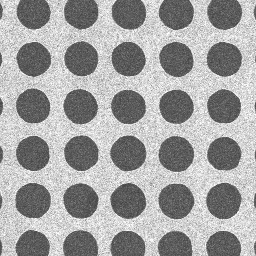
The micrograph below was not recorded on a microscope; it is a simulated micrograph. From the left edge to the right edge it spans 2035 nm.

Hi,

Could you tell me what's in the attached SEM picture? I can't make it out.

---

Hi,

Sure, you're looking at a regular array of holes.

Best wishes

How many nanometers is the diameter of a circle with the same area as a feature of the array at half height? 275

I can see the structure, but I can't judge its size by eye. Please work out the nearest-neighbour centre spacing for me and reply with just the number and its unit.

374 nm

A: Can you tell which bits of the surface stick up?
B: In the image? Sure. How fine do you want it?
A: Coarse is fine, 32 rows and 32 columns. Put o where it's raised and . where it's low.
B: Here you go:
oo....oo....oo....oo....oo....oo
oo....oo....oo....oo....oo....oo
oo....oo....oo....oo....oo....oo
ooo..oooo..oooo..oooo..oooo..ooo
oooooooooooooooooooooooooooooooo
ooo..oooo..oooo..oooo..oooo..ooo
oo....oo....oo....oo....oo....oo
oo....oo....oo....oo....oo....oo
oo....oo....oo....oo....oo....oo
oooo.ooooooooooo.oooo..ooooo.ooo
oooooooooooooooooooooooooooooooo
ooo..oooo..oooo..oooo..oooo..ooo
oo....oo....oo....oo....oo....oo
oo....oo....oo....oo....oo....oo
oo....oo....oo....oo....oo....oo
oooooooooo.ooooooooooooooooooooo
oooooooooooooooooooooooooooooooo
ooo..oooo...ooo..oooo..oooo..ooo
oo....oo....oo....oo....oo....oo
oo....oo....oo....oo....oo....oo
ooo...ooo...oo....oo....oo....oo
oooooooooooooooooooooooooooooooo
oooooooooooooooooooooooooooooooo
ooo...ooo..oooo..oooo...oo...ooo
oo....oo....oo....oo....oo....oo
oo....oo....oo....oo....oo....oo
oo....oo....oo....oo....oo....oo
oooooooooooooooooooooooooooooooo
oooooooooooooooooooooooooooooooo
ooo...oo....oo...ooo...ooo...ooo
oo....oo....oo....oo....oo....oo
oo....oo....oo....oo....oo....oo